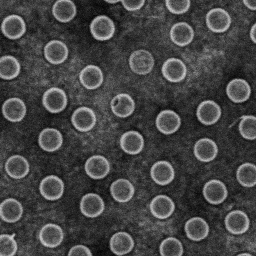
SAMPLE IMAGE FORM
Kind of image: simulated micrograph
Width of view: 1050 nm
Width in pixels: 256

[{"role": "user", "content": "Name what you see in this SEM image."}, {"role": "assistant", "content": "a regular array of raised bodies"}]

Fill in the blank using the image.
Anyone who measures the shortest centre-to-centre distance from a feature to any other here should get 0.158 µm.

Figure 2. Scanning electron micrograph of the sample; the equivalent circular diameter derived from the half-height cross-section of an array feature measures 92 nanometres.